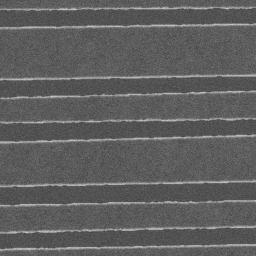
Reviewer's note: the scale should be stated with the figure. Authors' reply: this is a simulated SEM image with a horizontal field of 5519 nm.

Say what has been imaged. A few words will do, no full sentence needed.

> lines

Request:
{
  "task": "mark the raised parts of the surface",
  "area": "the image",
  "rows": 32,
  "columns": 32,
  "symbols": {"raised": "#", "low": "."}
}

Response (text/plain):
################################
................................
................................
################################
################################
################################
################################
################################
################################
###########################.....
................................
...............................#
################################
################################
################################
................................
................................
............####################
################################
################################
################################
################################
################################
................................
................................
............####################
################################
################################
#####################.#.........
................................
................................
################################